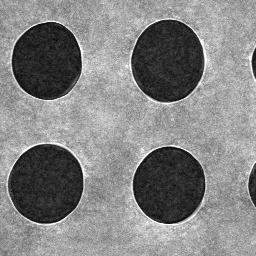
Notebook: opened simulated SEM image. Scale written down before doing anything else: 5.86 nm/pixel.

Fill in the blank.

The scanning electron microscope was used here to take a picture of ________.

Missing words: holes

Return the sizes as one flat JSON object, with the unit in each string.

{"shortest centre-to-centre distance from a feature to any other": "712 nm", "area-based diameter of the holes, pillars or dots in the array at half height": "76.3 px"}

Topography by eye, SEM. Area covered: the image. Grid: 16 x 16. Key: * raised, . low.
****************
***.******..****
*....****...****
*....***.....***
*....***.....***
*....****...****
****************
****************
****************
**..*****...****
*....****....***
*....***.....***
*....***.....***
*...*****...****
****************
****************